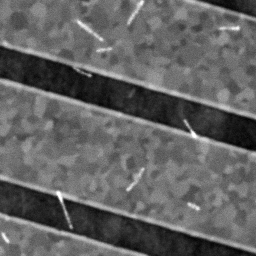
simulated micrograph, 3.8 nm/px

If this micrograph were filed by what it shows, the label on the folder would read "one or a few lines or trenches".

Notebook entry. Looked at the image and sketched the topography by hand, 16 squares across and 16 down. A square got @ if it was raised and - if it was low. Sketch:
@@@@@@@@@@@@@---
@@@@@@@@@@@@@@@@
@@@@@@@@@@@@@@@@
---@@@@@@@@@@@@@
------@@@@@@@@@@
@@--------@@@@@@
@@@@@--------@@@
@@@@@@@@@-------
@@@@@@@@@@@@----
@@@@@@@@@@@@@@@@
@@@@@@@@@@@@@@@@
-@@@@@@@@@@@@@@@
-----@@@@@@@@@@@
--------@@@@@@@@
@@@@--------@@@@
@@@@@@@--------@